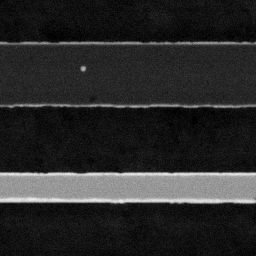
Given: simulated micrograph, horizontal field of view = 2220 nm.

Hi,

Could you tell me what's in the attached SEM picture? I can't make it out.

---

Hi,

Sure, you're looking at lines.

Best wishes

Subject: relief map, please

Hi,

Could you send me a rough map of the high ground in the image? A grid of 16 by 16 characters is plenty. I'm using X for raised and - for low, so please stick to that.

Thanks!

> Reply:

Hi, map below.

----------------
----------------
----------------
XXXXXXXXXXXXXXXX
XXXXXXXXXXXXXXXX
XXXXXXXXXXXXXXXX
XXXXXXXXXXXXXXXX
----------------
----------------
----------------
----------------
XXXXXXXXXXXXXXXX
XXXXXXXXXXXXXXXX
----------------
----------------
----------------